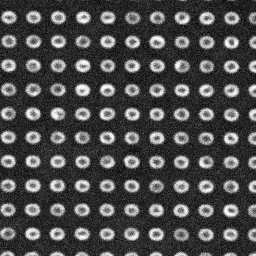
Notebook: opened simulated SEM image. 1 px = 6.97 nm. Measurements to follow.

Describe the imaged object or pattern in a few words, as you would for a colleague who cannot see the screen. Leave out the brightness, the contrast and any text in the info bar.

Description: a regular array of raised bodies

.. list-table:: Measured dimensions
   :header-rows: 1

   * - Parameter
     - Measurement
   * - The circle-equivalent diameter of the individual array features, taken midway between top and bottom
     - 0.0869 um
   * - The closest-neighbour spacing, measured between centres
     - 167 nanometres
